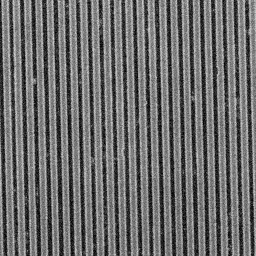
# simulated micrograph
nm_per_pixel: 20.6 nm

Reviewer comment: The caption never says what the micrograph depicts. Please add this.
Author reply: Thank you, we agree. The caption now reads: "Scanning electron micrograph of parallel lines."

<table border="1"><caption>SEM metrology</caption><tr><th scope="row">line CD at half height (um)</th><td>0.108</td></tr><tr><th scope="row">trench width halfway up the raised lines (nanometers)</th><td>108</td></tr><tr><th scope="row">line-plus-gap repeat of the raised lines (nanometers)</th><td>231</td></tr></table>